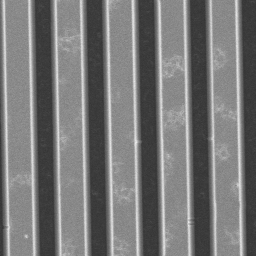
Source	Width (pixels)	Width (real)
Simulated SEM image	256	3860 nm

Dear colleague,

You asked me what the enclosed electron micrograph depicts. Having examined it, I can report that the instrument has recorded parallel lines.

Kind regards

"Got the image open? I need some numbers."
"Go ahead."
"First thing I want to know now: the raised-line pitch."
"780 nanometres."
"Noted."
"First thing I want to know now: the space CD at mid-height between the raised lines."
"317 nm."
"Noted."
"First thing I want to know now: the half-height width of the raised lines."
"462 nm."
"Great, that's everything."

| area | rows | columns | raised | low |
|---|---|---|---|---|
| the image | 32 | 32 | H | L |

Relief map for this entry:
HHHHLLLHHHLLLHHHHLLLHHHLLLHHHHLL
HHHHLLLHHHLLLHHHHLLLHHHLLLHHHHLL
HHHHLLLHHHLLLHHHHLLLHHHLLLHHHHLL
HHHHLLLHHHLLLHHHHLLLHHHLLLHHHHLL
HHHHLLLHHHHLLHHHHLLLHHHLLLHHHHLL
HHHHLLLHHHHLLHHHHLLLHHHLLLHHHHLL
HHHHLLLHHHHLLHHHHLLLHHHLLLHHHHLL
HHHHLLLHHHHLLHHHHLLLHHHLLLHHHHLL
HHHHLLLHHHHLLHHHHLLLHHHHLLHHHHLL
HHHHLLLHHHHLLHHHHLLLHHHHLLHHHHLL
HHHHLLLHHHHLLHHHHLLLHHHHLLHHHHLL
HHHHLLLHHHHLLHHHHLLLHHHHLLHHHHLL
HHHHLLLHHHHLLHHHHLLLHHHHLLHHHHLL
HHHHLLLHHHHLLHHHHLLLHHHHLLHHHHLL
LHHHLLLHHHHLLHHHHLLLHHHHLLHHHHLL
LHHHLLLHHHHLLHHHHLLLHHHHLLHHHHLL
LHHHLLLHHHHLLHHHHLLLHHHHLLHHHHLL
LHHHLLLHHHHLLHHHHLLLHHHHLLHHHHLL
LHHHLLLHHHHLLLHHHLLLHHHHLLHHHHLL
LHHHLLLHHHHLLLHHHLLLHHHHLLHHHHLL
LHHHLLLHHHHLLLHHHLLLHHHHLLHHHHLL
LHHHLLLHHHHLLLHHHLLLHHHHLLLHHHLL
LHHHLLLHHHHLLLHHHLLLHHHHLLLHHHLL
LHHHLLLHHHHLLLHHHLLLHHHHLLLHHHLL
LHHHLLLHHHHLLLHHHLLLHHHHLLLHHHLL
LHHHLLLHHHHLLLHHHLLLHHHHLLLHHHLL
LHHHLLLHHHHLLLHHHLLLHHHHLLLHHHLL
LHHHLLLHHHHLLLHHHLLLHHHHLLLHHHLL
LHHHHLLHHHHLLLHHHLLLHHHHLLLHHHLL
LHHHHLLHHHHLLLHHHLLLHHHHLLLHHHLL
LHHHHLLHHHHLLLHHHLLLHHHHLLLHHHLL
LHHHHLLHHHHLLLHHHLLLHHHHLLLHHHLL